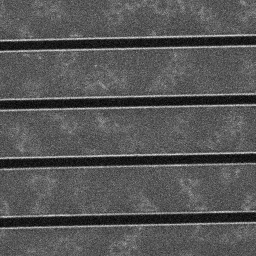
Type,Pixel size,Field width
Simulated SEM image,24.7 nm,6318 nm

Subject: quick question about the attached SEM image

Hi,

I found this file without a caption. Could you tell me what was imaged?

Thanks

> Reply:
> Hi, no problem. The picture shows parallel lines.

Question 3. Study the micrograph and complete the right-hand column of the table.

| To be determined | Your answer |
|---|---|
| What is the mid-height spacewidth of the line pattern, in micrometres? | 1.17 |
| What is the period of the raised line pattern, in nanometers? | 1450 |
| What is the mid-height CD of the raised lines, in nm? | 274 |